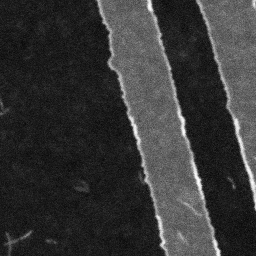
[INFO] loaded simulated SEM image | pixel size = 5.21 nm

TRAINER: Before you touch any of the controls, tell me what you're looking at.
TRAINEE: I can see one or a few lines or trenches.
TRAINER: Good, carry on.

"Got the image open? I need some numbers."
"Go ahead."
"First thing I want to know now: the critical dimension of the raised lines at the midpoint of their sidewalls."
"264 nanometres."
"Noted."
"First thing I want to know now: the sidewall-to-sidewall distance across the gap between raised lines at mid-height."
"253 nanometres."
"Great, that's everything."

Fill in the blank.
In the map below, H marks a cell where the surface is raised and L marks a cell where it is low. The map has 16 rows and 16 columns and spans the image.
LLLLLLHHHHLLLHHH
LLLLLLLHHHLLLHHH
LLLLLLLHHHLLLHHH
LLLLLLLHHHLLLHHH
LLLLLLLHHHHLLLHH
LLLLLLLLHHHLLLHH
LLLLLLLLHHHLLLHH
LLLLLLLLHHHLLLLH
LLLLLLLLHHHHLLLH
LLLLLLLLLHHHLLLH
LLLLLLLLLHHHLLLH
LLLLLLLLLHHHHLLL
LLLLLLLLLLHHHLLL
LLLLLLLLLLHHHLLL
LLLLLLLLLLHHHLLL
LLLLLLLLLLHHHHLL